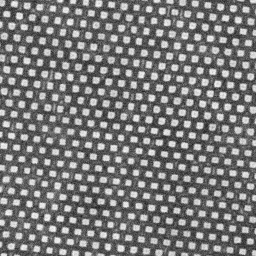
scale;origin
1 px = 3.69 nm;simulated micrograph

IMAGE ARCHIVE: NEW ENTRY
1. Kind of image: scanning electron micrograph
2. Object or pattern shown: a regular array of raised bodies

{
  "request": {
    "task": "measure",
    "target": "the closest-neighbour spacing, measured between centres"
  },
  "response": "46 nanometres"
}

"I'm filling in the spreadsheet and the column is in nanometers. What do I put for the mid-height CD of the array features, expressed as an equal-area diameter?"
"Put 24.6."